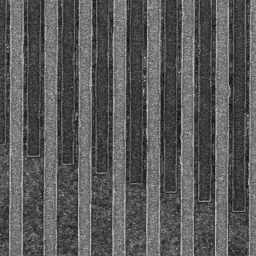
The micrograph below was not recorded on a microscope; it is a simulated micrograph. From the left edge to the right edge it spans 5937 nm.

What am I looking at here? parallel lines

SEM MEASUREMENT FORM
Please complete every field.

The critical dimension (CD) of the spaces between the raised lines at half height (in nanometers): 113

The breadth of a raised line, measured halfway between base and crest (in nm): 287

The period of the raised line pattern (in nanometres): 397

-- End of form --